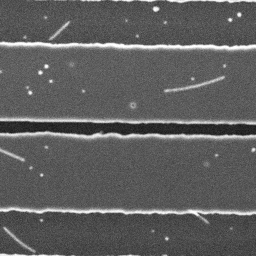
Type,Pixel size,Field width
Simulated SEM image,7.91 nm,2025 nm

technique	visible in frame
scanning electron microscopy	lines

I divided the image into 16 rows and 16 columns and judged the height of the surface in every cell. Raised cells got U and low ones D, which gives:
DDDDDDDDDDDDDDDD
DDDDDDDDDDDDDDDD
DDDDDDDDDDDDDDDD
UUUUUUUUUUUUUUUU
UUUUUUUUUUUUUUUU
UUUUUUUUUUUUUUUU
UUUUUUUUUUUUUUUU
UUUUUUUUUUUUUUUU
UUUUUUUUUUUUUUUU
UUUUUUUUUUUUUUUU
UUUUUUUUUUUUUUUU
UUUUUUUUUUUUUUUU
UUUUUUUUUUUUUUUU
DDDDDDDDDDDDDDDD
DDDDDDDDDDDDDDDD
DDDDDDDDDDDDDDDD